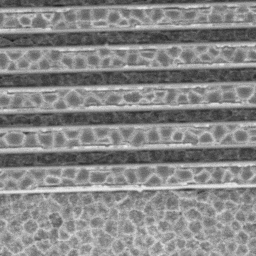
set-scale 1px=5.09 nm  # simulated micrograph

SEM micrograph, parallel lines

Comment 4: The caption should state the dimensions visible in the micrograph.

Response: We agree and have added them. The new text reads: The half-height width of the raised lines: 120 nm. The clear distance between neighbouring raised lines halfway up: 80.1 nm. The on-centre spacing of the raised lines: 203 nanometres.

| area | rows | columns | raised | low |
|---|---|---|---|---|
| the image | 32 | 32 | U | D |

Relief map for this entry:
DDDDDDDDDDDDDDDDDDDDDDDDDDDUUUUU
UUUUUUUUUUUUUUUUUUUUUUUUUUUUUUUU
UUUUUUUUUUUUUUUUUUUUUUUUUUUUUUUU
UUUUUUUUUUUUUUUUUUUUUDDDDDDDDDDD
DDDDDDDDDDDDDDDDDDDDDDDDDDDDDDDD
DDDDDDDDDDDDDDDDDDDDDDDDDDDUUUUU
UUUUUUUUUUUUUUUUUUUUUUUUUUUUUUUU
UUUUUUUUUUUUUUUUUUUUUUUUUUUUUUUU
UUUUUUUUUUUUUUUUUUUUUDDDDDDDDDDD
DDDDDDDDDDDDDDDDDDDDDDDDDDDDDDDD
DDDDDDDDDDDDDDDDDDDDDDDDDDDDUUUU
UUUUUUUUUUUUUUUUUUUUUUUUUUUUUUUU
UUUUUUUUUUUUUUUUUUUUUUUUUUUUUUUU
UUUUUUUUUUUUUUUUUUUUUDDDDDDDDDDD
DDDDDDDDDDDDDDDDDDDDDDDDDDDDDDDD
DDDDDDDDDDDDDDDDDDDDDDDDUUUUUUUU
UUUUUUUUUUUUUUUUUUUUUUUUUUUUUUUU
UUUUUUUUUUUUUUUUUUUUUUUUUUUUUUUU
UUUUUUUUUUUUUUUUUUUUUDDDDDDDDDDD
DDDDDDDDDDDDDDDDDDDDDDDDDDDDDDDD
DDDDDDDDDDDDDDDDDDDDDDDDUUUUUUUU
UUUUUUUUUUUUUUUUUUUUUUUUUUUUUUUU
UUUUUUUUUUUUUUUUUUUUUUUUUUUUUUUU
UUUUUUUUUUUUUUUUUUDDDDDDDDDDDDDD
DDDDDDDDDDDDDDDDDDDDDDDDDDDDDDDD
DDDDDDDDDDDDDDDDDDDDDDDDDDDDDDDD
DDDDDDDDDDDDDDDDDDDDDDDDDDDDDDDD
DDDDDDDDDDDDDDDDDDDDDDDDDDDDDDDD
DDDDDDDDDDDDDDDDDDDDDDDDDDDDDDDD
DDDDDDDDDDDDDDDDDDDDDDDDDDDDDDDD
DDDDDDDDDDDDDDDDDDDDDDDDDDDDDDDD
DDDDDDDDDDDDDDDDDDDDDDDDDDDDDDDD